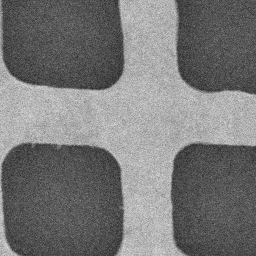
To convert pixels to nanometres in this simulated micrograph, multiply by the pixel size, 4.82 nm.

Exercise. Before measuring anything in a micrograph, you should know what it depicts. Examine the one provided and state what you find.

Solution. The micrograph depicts holes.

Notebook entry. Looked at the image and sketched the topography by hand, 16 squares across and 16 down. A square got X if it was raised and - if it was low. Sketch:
-------XXXX-----
--------XXX-----
--------XXX-----
--------XXX-----
X-------XXX-----
XXXX---XXXXX----
XXXXXXXXXXXXXXXX
XXXXXXXXXXXXXXXX
XXXXXXXXXXXXXXXX
X------XXXX-----
--------XXX-----
--------XXX-----
--------XXX-----
--------XXX-----
--------XXX-----
X-------XXX-----